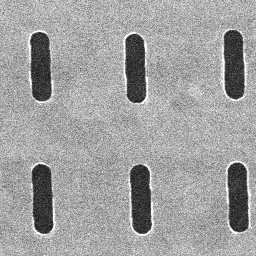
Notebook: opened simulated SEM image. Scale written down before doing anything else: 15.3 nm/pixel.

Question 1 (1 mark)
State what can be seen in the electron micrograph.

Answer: holes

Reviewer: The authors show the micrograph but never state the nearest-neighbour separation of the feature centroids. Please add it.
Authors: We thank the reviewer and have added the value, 1490 nm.